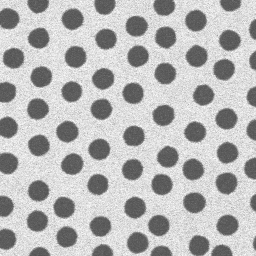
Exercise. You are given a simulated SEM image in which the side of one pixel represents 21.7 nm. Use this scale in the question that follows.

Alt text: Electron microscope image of a regular array of holes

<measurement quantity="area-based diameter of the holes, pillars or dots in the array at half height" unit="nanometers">471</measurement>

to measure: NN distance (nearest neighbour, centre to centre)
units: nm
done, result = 687